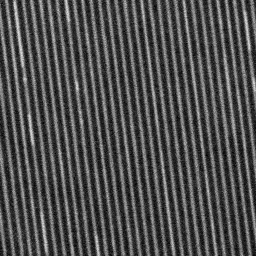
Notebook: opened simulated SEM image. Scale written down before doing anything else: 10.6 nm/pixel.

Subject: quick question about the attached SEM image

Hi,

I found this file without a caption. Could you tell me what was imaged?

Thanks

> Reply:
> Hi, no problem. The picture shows parallel lines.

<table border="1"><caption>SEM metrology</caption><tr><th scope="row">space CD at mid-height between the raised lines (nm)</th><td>64.3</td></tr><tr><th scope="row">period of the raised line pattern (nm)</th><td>88.6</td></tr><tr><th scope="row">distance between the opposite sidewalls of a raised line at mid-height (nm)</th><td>25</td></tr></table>